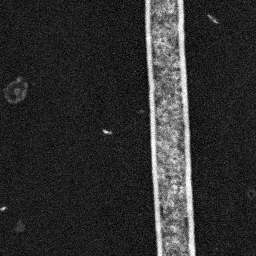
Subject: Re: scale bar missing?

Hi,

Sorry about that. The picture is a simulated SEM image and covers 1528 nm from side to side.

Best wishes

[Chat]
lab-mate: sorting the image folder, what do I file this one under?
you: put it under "one or a few lines or trenches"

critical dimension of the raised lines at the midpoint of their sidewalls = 201 nm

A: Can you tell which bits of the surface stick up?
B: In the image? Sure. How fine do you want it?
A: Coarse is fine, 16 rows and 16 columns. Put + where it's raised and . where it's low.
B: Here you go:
.........++.....
.........++.....
.........++.....
.........++.....
.........++.....
.........+++....
..........++....
..........++....
..........++....
..........++....
..........++....
..........++....
..........++....
..........++....
..........++....
..........++....